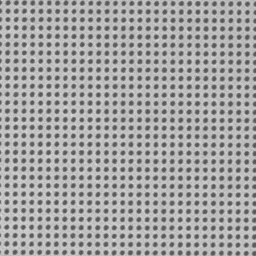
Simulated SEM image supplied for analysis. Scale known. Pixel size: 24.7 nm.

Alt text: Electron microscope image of a regular array of holes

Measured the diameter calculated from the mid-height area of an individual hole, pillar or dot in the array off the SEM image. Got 137 nm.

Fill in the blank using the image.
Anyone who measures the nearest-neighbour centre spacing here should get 194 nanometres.